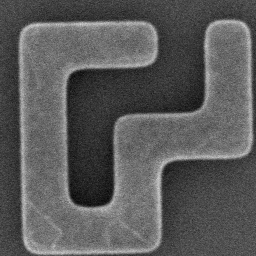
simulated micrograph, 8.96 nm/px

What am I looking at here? wiring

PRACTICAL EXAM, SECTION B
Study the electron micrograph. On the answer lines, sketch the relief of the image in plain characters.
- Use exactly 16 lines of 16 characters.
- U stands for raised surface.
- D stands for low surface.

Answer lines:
DDDDDDDDDDDDDDDD
DDUUUUUUUDDDDUUD
DUUUUUUUUUDDDUUU
DUUUUUUUUUDDDUUU
DUUUUDDDDDDDDUUU
DUUUDDDDDDDDDUUU
DUUUDDDDDDDDDUUU
DUUUDDDUUUUUUUUU
DUUUDDDUUUUUUUUU
DUUUDDDUUUUUUUUD
DUUUDDDUUUDDDDDD
DUUUDDDUUUDDDDDD
DUUUUDDUUUDDDDDD
DUUUUUUUUUDDDDDD
DUUUUUUUUUDDDDDD
DDUUUUUUUUDDDDDD